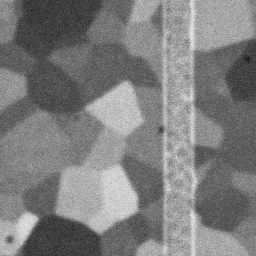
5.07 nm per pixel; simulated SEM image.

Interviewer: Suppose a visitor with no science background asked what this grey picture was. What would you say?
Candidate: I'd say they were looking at one or a few lines or trenches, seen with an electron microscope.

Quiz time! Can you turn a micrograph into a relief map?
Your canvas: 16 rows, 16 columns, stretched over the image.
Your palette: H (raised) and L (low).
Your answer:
HHHHHHHHHHLLHHHH
HHHHHHHHHHLLHHHH
HHHHHHHHHHLLHHHH
HHHHHHHHHHLLHHHH
HHHHHHHHHHLLHHHH
HHHHHHHHHHLLHHHH
HHHHHHHHHHLLHHHH
HHHHHHHHHHLLHHHH
HHHHHHHHHHLLHHHH
HHHHHHHHHHLLHHHH
HHHHHHHHHHLLHHHH
HHHHHHHHHHLLHHHH
HHHHHHHHHHLLHHHH
HHHHHHHHHHLLHHHH
HHHHHHHHHHLLHHHH
HHHHHHHHHHLLHHHH